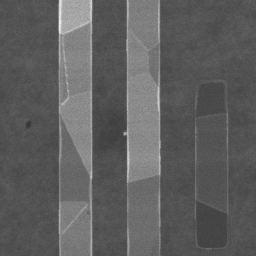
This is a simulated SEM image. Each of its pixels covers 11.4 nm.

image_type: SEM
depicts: groups of lines, slits or small figures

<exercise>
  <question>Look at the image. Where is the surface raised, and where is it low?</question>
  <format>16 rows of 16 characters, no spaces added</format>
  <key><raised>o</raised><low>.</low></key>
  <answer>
....oo..oo......
....oo..oo......
....oo..oo......
....oo..oo......
....oo..oo......
....oo..oo..oo..
....oo..oo..oo..
....oo..oo..oo..
....oo..oo..oo..
....oo..oo..oo..
....oo..oo..oo..
....oo..oo..oo..
....oo..oo..oo..
....oo..oo..oo..
....oo..oo..oo..
....oo..oo...o..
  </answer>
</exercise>